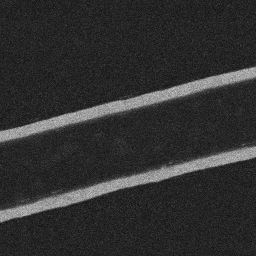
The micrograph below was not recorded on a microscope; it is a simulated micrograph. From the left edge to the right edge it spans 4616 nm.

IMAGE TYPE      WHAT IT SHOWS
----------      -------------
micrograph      one or a few lines or trenches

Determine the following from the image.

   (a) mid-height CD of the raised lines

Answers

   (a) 79.2 pixels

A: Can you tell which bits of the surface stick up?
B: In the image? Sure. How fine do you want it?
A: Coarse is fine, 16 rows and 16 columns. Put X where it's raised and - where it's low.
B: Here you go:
----------------
----------------
----------------
----------------
----------------
------------XXXX
--------XXXXXXXX
----XXXXXXXXXXXX
XXXXXXXXXXXXXXXX
XXXXXXXXXXXXXXXX
XXXXXXXXXXXX----
XXXXXXXX--------
XXXX------------
----------------
----------------
----------------